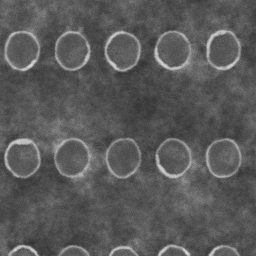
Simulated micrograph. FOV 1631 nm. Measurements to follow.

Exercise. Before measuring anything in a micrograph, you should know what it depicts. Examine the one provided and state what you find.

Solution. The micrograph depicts a regular array of raised bodies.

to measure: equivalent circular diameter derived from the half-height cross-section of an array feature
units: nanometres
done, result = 233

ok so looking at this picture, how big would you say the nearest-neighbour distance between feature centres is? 318 nanometers